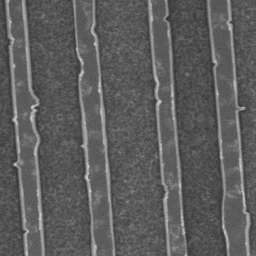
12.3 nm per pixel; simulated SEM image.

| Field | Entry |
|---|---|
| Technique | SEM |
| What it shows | one or a few lines or trenches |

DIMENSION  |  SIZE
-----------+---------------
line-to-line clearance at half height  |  607 nanometres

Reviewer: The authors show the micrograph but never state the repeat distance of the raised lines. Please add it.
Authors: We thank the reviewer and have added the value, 832 nanometres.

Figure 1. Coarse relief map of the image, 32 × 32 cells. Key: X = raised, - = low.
-XX------XXX-------XX-----XXX---
-XX------XXX-------XX-----XXX---
-XX------XXX-------XX-----XXX---
-XX------XXX-------XX-----XXX---
-XX-------XX-------XX-----XXX---
-XX-------XX-------XX------XX---
-XXX------XX-------XX------XX---
-XXX------XX-------XX------XX---
-XXX------XX-------XX------XX---
--XX------XXX------XXX-----XX---
--XX------XXX-------XX-----XX---
--XX------XXX-------XX-----XXX--
--XXX-----XXX-------XX-----XXX--
--XXX-----XXX-------XX-----XXX--
--XX------XXX-------XX-----XXX--
--XX------XXX-------XX-----XXX--
--XXX------XX-------XX-----XXX--
--XXX------XX-------XX-----XXX--
--XXX------XX-------XX------XX--
--XXX------XX-------XX------XX--
--XXX------XX-------XX------XX--
--XXX------XX-------XX------XX--
--XXX------XXX------XXX-----XX--
---XX------XXX-------XX-----XX--
---XX------XXX-------XX-----XXX-
---XX------XXX-------XX-----XXX-
---XX------XXX-------XX-----XXX-
---XX-------XX-------XX-----XXX-
---XX------XXX-------XX-----XXX-
---XX-------XX-------XX-----XXX-
---XX-------XX-------XX-----XXX-
---XX-------XX-------XX-----XXX-